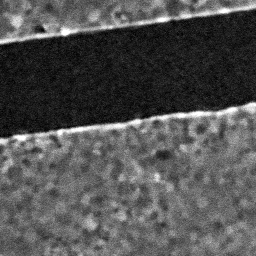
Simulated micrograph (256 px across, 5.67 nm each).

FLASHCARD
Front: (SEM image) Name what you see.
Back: one or a few lines or trenches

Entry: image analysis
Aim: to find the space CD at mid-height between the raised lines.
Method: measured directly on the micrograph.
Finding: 0.548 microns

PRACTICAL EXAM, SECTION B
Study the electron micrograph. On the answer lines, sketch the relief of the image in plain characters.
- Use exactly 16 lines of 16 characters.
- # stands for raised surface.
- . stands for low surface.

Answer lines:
################
########........
#...............
................
................
................
................
.........#######
.###############
################
################
################
################
################
################
################